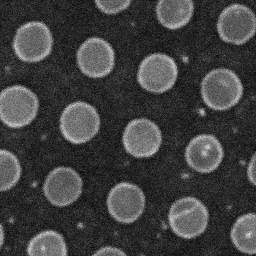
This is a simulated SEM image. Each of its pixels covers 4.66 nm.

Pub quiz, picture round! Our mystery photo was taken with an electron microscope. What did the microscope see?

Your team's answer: a regular array of raised bodies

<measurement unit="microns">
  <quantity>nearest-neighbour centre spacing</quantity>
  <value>0.298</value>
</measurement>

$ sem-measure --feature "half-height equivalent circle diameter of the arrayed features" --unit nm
173